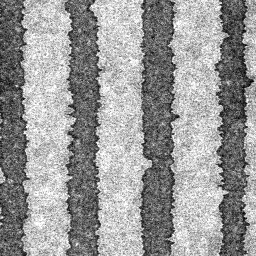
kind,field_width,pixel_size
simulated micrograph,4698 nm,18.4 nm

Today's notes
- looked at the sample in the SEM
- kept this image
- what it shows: one or a few lines or trenches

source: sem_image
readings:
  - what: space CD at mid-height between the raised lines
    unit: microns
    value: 0.546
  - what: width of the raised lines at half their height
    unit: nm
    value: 791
